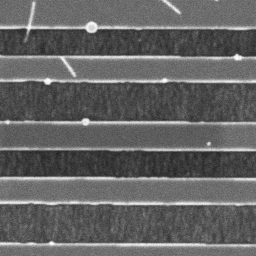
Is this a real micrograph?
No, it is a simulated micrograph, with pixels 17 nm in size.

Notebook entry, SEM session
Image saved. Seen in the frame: lines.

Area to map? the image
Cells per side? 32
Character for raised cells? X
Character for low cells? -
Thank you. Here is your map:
XXXXXXXXXXXXXXXXXXXXXXXXXXXXXXXX
XXXXXXXXXXXXXXXXXXXXXXXXXXXXXXXX
XXXXXXXXXXXXXXXXXXXXXXXXXXXXXXXX
XXXXXXXXXXXXXXXXXXXXXXXXXXXXXXXX
--------------------------------
--------------------------------
--------------------------------
XXXXXXXXXXXXXXXXXXXXXXXXXXXXXXXX
XXXXXXXXXXXXXXXXXXXXXXXXXXXXXXXX
XXXXXXXXXXXXXXXXXXXXXXXXXXXXXXXX
--------------------------------
--------------------------------
--------------------------------
--------------------------------
--------------------------------
XXXXXXXXXXXXXXXXXXXXXXXXXXXXXXXX
XXXXXXXXXXXXXXXXXXXXXXXXXXXXXXXX
XXXXXXXXXXXXXXXXXXXXXXXXXXXXXXXX
XXXXXXXXXXXXXXXXXXXXXXXXXXXXXXXX
--------------------------------
--------------------------------
--------------------------------
XXXXXXXXXXXXXXXXXXXXXXXXXXXXXXXX
XXXXXXXXXXXXXXXXXXXXXXXXXXXXXXXX
XXXXXXXXXXXXXXXXXXXXXXXXXXXXXXXX
-----XXX---XX-XXXXXXXXXXXXXXXXXX
--------------------------------
--------------------------------
--------------------------------
--------------------------------
XXXXX-X-------------------------
XXXXXXXXXXXXXXXXXXXXXXXXXXXXXXXX